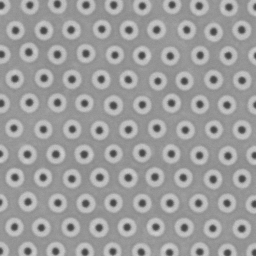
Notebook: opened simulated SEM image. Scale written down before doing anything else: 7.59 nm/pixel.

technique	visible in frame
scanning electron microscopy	a regular array of ring-shaped raised bodies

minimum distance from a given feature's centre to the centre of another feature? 206 nm